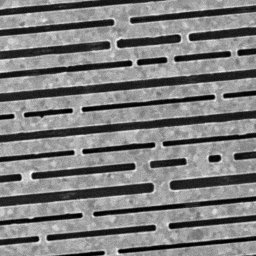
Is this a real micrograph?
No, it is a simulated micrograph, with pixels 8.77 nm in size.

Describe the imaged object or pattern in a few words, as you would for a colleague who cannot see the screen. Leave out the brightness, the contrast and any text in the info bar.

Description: parallel lines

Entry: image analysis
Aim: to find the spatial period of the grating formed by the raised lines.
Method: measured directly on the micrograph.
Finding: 183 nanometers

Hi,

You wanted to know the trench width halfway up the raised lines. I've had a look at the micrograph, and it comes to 60 nanometers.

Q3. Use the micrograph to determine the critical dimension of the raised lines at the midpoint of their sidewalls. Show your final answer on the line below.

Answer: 120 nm